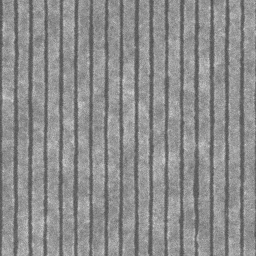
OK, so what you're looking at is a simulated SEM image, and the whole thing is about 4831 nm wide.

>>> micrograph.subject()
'parallel lines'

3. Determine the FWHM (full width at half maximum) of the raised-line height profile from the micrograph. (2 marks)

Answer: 196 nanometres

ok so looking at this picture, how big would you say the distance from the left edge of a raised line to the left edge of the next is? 285 nm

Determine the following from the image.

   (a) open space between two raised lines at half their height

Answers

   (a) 92 nanometres